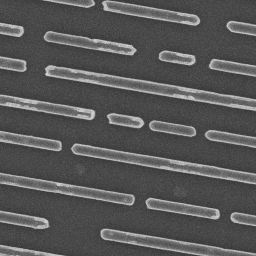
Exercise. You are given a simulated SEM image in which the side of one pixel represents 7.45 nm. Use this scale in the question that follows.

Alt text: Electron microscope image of parallel lines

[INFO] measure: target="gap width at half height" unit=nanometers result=202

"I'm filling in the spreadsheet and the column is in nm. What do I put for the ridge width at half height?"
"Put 71.6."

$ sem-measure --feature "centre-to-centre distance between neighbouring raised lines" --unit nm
278